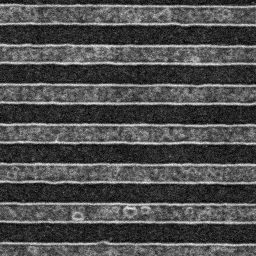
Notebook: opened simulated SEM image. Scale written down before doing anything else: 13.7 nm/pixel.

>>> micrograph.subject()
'parallel lines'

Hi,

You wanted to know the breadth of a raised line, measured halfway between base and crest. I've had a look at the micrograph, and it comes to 253 nanometers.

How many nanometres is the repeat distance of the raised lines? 541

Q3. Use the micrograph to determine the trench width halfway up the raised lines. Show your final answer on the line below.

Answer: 21.4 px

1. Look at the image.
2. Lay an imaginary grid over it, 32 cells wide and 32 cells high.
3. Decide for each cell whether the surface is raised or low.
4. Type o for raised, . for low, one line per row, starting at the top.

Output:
................................
oooooooooooooooooooooooooooooooo
oooooooooooooooooooooooooooooooo
................................
................................
................................
oooooooooooooooooooooooooooooooo
oooooooooooooooooooooooooooooooo
................................
................................
................................
oooooooooooooooooooooooooooooooo
oooooooooooooooooooooooooooooooo
................................
................................
....o...........................
oooooooooooooooooooooooooooooooo
oooooooooooooooooooooooooooooooo
................................
................................
o...o...........................
oooooooooooooooooooooooooooooooo
oooooooooooooooooooooooooooooooo
................................
................................
ooo.ooooooo.....................
oooooooooooooooooooooooooooooooo
oooooooooooooooooooooooooooooooo
................................
................................
oooooooooooooo..................
oooooooooooooooooooooooooooooooo